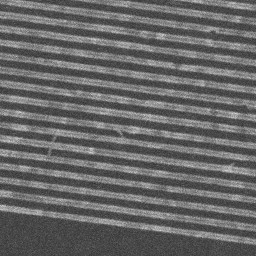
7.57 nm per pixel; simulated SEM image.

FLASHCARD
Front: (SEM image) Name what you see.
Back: parallel lines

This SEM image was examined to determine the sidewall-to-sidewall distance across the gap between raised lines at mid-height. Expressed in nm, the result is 60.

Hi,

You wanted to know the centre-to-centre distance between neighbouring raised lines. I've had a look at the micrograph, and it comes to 103 nm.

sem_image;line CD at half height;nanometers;37.5